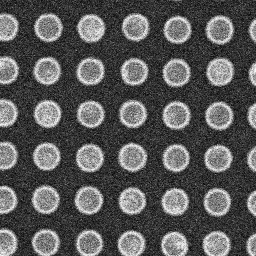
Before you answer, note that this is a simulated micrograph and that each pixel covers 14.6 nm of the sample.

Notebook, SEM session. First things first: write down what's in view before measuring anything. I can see a regular array of raised bodies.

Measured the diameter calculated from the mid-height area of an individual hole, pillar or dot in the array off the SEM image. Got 378 nanometers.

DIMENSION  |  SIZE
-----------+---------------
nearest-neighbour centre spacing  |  618 nm